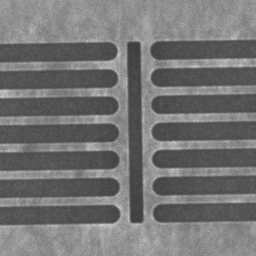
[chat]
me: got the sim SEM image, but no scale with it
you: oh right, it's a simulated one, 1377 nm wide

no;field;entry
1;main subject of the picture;groups of lines, slits or small figures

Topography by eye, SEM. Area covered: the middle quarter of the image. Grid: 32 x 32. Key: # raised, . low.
################...#############
............####...####.........
.............###...###..........
..............##...###..........
.............###...###..........
.............###...####.........
################...#############
################...#############
.............###...####.........
..............##...###..........
..............##...###..........
..............##...###..........
.............###...####.........
################...#############
################...#############
.............###...###..........
..............##....##..........
..............##....##..........
.............###....##..........
............####....############
################....############
################....####........
.............###....##..........
..............##....##..........
..............##....##..........
.............###....###.........
..........######....############
################....############
######......####....####........
..............##....##..........
..............##....##..........
..............##....##..........